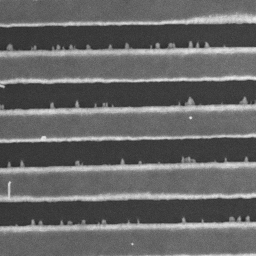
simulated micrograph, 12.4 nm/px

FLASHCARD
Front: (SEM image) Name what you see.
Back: lines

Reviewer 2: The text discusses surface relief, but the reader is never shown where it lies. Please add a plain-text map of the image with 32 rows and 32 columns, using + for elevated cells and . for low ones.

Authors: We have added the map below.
++++++++++++++++++++++++++++++++
++++++++++++++++++++++++++++++++
++++++++++++++++++++++++++++++++
................................
................................
................................
++++++++++++++++++++++++++++++++
++++++++++++++++++++++++++++++++
++++++++++++++++++++++++++++++++
++++++++++++++++++++++++++++++++
+...............................
................................
................................
.............+.+++++++++++++++++
++++++++++++++++++++++++++++++++
++++++++++++++++++++++++++++++++
++++++++++++++++++++++++++++++++
++++++++++......................
................................
................................
.........................+++++++
++++++++++++++++++++++++++++++++
++++++++++++++++++++++++++++++++
++++++++++++++++++++++++++++++++
++++++++++++++++++++++++++++++++
................................
................................
................................
++++++++++++++++++++++++++++++++
++++++++++++++++++++++++++++++++
++++++++++++++++++++++++++++++++
++++++++++++++++++++++++++++++++